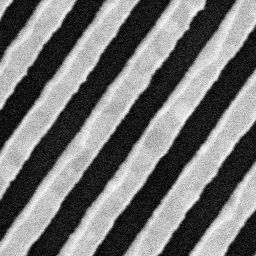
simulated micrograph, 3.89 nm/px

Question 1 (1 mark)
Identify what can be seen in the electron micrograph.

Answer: lines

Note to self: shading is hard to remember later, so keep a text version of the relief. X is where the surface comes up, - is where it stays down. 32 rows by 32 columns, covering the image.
X----XXXX-----XXX-----XXXX----XX
-----XXXX----XXX-----XXXX----XXX
----XXXX----XXXX----XXXX----XXXX
---XXXX----XXXX----XXXXX----XXXX
---XXX-----XXX-----XXXX----XXXX-
--XXXX----XXXX----XXXX-----XXX--
-XXXX----XXXX----XXXX-----XXXX--
XXXX----XXXX----XXXXX----XXXX---
XXXX----XXXX----XXXX----XXXX----
XXX----XXXX----XXXX----XXXX-----
XX----XXXX----XXXXX----XXXX----X
XX----XXX-----XXXX----XXXX----XX
X----XXXX----XXXX----XXXX----XXX
----XXXX----XXXX----XXXX-----XXX
---XXXX-----XXXX----XXXX----XXXX
---XXXX----XXXX----XXXX----XXXXX
--XXXX----XXXX----XXXX-----XXXX-
-XXXX-----XXX-----XXXX----XXXX--
-XXX-----XXXX----XXXX----XXXX---
XXXX----XXXX----XXXX-----XXX----
XXX----XXXX-----XXXX----XXXX----
XX-----XXXX----XXXX----XXXX----X
XX----XXXX----XXXX----XXXX----XX
X----XXXX-----XXXX----XXX-----XX
----XXXX-----XXXX----XXXX----XXX
----XXXX----XXXX----XXXX-----XXX
---XXXX----XXXX----XXXX-----XXXX
--XXXX-----XXX-----XXXX----XXXX-
-XXXXX----XXXX----XXXX----XXXX--
-XXXX----XXXX----XXXX-----XXXX--
XXXX-----XXX-----XXXX----XXXX---
XXX-----XXXX----XXXX----XXXX----